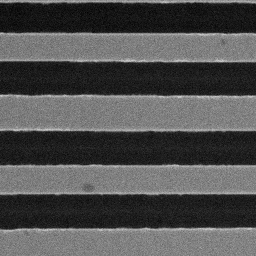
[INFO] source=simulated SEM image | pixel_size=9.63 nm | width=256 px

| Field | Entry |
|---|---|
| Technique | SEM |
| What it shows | lines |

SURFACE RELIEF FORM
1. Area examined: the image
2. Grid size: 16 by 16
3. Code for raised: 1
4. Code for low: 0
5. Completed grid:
0000000000000000
0000000000000000
1111111111111111
1111111111111111
0000000000000000
0000000000000000
1111111111111111
1111111111111111
0000000000000000
0000000000000000
1111111111111111
1111111111111111
0000000000000000
0000000000000000
1111111111111111
1111111111111111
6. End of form